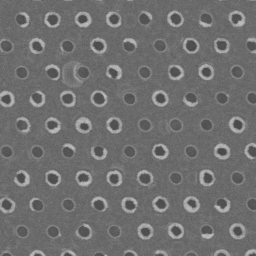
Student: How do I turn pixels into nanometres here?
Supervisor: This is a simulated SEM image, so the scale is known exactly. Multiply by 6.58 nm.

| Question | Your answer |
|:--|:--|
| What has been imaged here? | a regular array of holes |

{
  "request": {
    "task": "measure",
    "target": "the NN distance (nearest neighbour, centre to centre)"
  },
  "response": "198 nanometers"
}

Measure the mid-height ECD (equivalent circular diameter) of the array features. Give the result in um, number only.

0.0701